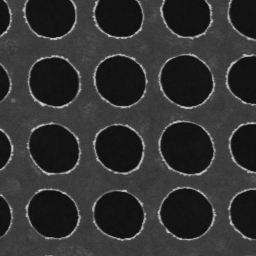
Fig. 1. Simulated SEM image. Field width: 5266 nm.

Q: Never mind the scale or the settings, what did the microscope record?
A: a regular array of holes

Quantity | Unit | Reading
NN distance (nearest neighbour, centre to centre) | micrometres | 1.35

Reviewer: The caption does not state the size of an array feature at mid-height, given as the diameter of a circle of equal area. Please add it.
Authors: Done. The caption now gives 1020 nm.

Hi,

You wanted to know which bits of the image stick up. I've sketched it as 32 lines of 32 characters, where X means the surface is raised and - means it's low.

-XX------XXX-----XXX------XXX---
-XX------XXX------XX------XXX---
-XX------XXX------XXX-----XXX---
-XXX-----XXXX----XXXX-----XXX---
XXXXX---XXXXXX--XXXXXXX-XXXXXXX-
XXXXXXXXXXXXXXXXXXXXXXXXXXXXXXXX
XXXXXXXXXXXXXXXXXXXXXXXXXXXXXXXX
XXXXX---XXXXX----XXXX----XXXXX--
XXXX-----XXX------XX------XXX---
-XXX------XX------XX------XXX---
-XXX------XX------XX-------XX---
-XXX------XX------XX------XXX---
XXXXX----XXXX----XXXX-----XXXX--
XXXXXXXXXXXXXXXXXXXXXXXXXXXXXXXX
XXXXXXXXXXXXXXXXXXXXXXXXXXXXXXXX
XXXXXXXXXXXXXXXXXXXXXX--XXXXXXX-
XXXX-----XXXX----XXX------XXX---
-XXX------XX------XX------XXX---
-XXX------XX------XX-------XX---
-XXX------XX------XX-------XX---
-XXXX-----XXX----XXXX-----XXXX--
XXXXXX--XXXXXX--XXXXXXX--XXXXXXX
XXXXXXXXXXXXXXXXXXXXXXXXXXXXXXXX
XXXXXXXXXXXXXXXXXXXXXXXXXXXXXXXX
XXXX----XXXXX----XXXX----XXXXX--
-XXX-----XXX-----XXX------XXX---
-XXX------XX------XX-------XX---
-XXX------XX------XX-------XX---
-XXX-----XXX------XXX-----XXXX--
XXXXXX--XXXXXX---XXXXX---XXXXXX-
XXXXXXXXXXXXXXXXXXXXXXXXXXXXXXXX
XXXXXXXXXXXXXXXXXXXXXXXXXXXXXXXX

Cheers